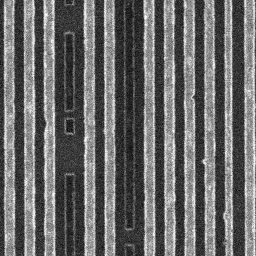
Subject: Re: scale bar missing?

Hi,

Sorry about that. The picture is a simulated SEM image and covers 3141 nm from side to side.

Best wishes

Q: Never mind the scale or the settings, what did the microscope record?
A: parallel lines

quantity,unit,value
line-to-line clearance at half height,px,11.2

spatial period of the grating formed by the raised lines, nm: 246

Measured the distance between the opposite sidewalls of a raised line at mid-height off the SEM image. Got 104 nanometres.